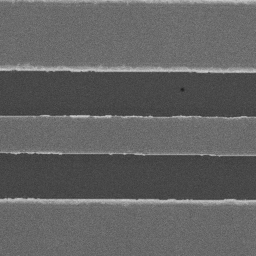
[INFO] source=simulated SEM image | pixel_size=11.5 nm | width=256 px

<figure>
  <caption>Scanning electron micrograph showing lines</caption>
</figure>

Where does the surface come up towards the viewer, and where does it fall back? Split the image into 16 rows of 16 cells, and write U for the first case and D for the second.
UUUUUUUUUUUUUUUU
UUUUUUUUUUUUUUUU
UUUUUUUUUUUUUUUU
UUUUUUUUUUUUUUUU
DDDDDDDDDDDDDDDD
DDDDDDDDDDDDDDDD
DDDDDDDDDDDDDDDD
UUUUUUUUUUUUUUUU
UUUUUUUUUUUUUUUU
UUUUUUUUUUUUUUUU
DDDDDDDDDDDDDDDD
DDDDDDDDDDDDDDDD
DDDDDDDDDDDDDDDD
UUUUUUUUUUUUUUUU
UUUUUUUUUUUUUUUU
UUUUUUUUUUUUUUUU